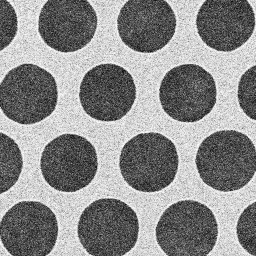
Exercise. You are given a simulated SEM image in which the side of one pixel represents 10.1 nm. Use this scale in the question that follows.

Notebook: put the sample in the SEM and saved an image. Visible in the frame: holes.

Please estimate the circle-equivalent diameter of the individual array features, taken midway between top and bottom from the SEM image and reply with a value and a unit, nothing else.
589 nm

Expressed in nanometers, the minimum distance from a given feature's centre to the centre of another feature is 804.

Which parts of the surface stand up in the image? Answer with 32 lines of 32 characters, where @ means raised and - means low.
-@@@@@-----@@@@@-----@@@@------@
--@@@-------@@@-------@@@-------
--@@@-------@@@-------@@--------
--@@@-------@@@-------@@@-------
--@@@-------@@@-------@@@------@
-@@@@@-----@@@@@-----@@@@@----@@
@@@@@@@@-@@@@@@@@--@@@@@@@@@-@@@
@@@@@@@@@@@@@@@@@@@@@@@@@@@@@@@@
@@---@@@@@@@---@@@@@@@---@@@@@@-
@------@@@------@@@@@-----@@@@--
-------@@@-------@@@-------@@@--
-------@@@-------@@@-------@@@--
-------@@@-------@@@-------@@@--
-------@@@------@@@@-------@@@--
@-----@@@@@-----@@@@@-----@@@@@-
@@@-@@@@@@@@@@@@@@@@@@@@@@@@@@@@
@@@@@@@@@@@@@@@@@@@@@@@@@@@---@@
--@@@@@----@@@@@-----@@@@------@
--@@@-------@@@-------@@@-------
---@@-------@@@-------@@@-------
---@@-------@@@-------@@--------
---@@-------@@@-------@@@-------
--@@@@------@@@@------@@@------@
-@@@@@@---@@@@@@@---@@@@@@----@@
@@@@@@@@@@@@@@@@@@@@@@@@@@@@@@@@
@@---@@@@@@-----@@@@@@---@@@@@@-
@------@@@-------@@@-------@@@--
-------@@@-------@@@-------@@@--
-------@@@-------@@--------@@---
-------@@@-------@@--------@@@--
-------@@@-------@@@-------@@@--
@-----@@@@@-----@@@@@-----@@@@@-